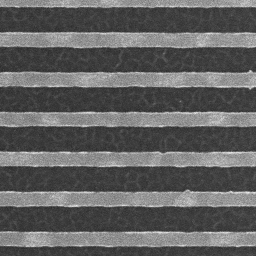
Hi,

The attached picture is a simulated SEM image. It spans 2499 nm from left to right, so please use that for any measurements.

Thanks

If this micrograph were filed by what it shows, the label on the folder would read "parallel lines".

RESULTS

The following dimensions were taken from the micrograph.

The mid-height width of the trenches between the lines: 0.251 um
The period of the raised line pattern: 39.8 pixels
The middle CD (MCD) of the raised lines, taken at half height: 0.131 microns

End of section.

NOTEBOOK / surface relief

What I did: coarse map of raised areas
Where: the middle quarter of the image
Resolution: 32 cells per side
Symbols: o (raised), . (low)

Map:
................................
................................
oooooooooooooooooooooooooooooooo
oooooooooooooooooooooooooooooooo
oooooooooooooooooooooooooooooooo
oo.ooooooooooooo....oooooooooooo
................................
................................
................................
................................
................................
................................
oooooooooooooooooooooooooooooooo
oooooooooooooooooooooooooooooooo
oooooooooooooooooooooooooooooooo
....oo.........o......oo.....o.o
................................
................................
................................
................................
................................
................................
oooooooooooooooooooooooo.ooooooo
oooooooooooooooooooooooooooooooo
oooooooooooooooooooooooooooooooo
........ooo...o..............o..
................................
................................
................................
................................
................................
................................